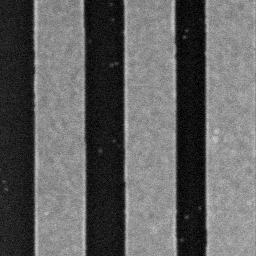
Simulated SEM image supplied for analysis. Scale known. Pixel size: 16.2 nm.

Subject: lines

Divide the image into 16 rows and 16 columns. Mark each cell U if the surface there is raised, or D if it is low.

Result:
DDUUUDDDUUUDDUUU
DDUUUDDDUUUDDUUU
DDUUUDDDUUUDDUUU
DDUUUDDDUUUDDUUU
DDUUUDDDUUUDDUUU
DDUUUDDDUUUDDUUU
DDUUUDDDUUUDDUUU
DDUUUDDDUUUDDUUU
DDUUUDDDUUUDDUUU
DDUUUDDDUUUDDUUU
DDUUUDDDUUUDDUUU
DDUUUDDDUUUDDUUU
DDUUUDDDUUUDDUUU
DDUUUDDDUUUDDUUU
DDUUUDDDUUUDDUUU
DDUUUDDDUUUDDUUU